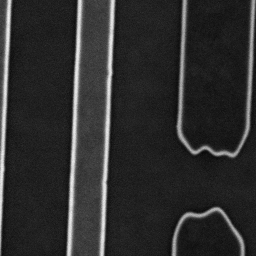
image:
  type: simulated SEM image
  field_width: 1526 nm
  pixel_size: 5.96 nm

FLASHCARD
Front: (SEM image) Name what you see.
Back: one or a few lines or trenches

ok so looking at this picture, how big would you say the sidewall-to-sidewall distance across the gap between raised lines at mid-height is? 0.425 um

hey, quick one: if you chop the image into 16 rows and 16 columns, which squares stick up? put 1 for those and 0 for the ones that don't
1000011000001111
0000011000011111
0000011000011111
0000011000011111
0000011000011111
0000011000011111
0000011000011111
0000011000011110
0000011000011110
0000011000000110
0000011000000000
0000111000000000
0000111000000000
0000110000001100
0000110000011110
0000110000011110